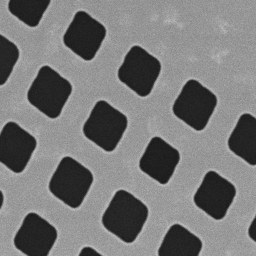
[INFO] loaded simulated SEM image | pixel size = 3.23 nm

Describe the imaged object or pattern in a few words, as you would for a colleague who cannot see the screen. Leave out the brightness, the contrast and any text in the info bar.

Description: a regular array of holes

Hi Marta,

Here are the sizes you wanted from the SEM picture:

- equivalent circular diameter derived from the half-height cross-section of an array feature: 140 nm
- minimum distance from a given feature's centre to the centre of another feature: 0.21 um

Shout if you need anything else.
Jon